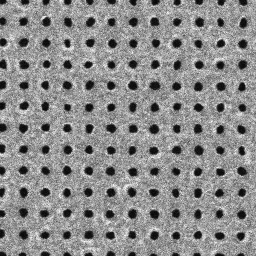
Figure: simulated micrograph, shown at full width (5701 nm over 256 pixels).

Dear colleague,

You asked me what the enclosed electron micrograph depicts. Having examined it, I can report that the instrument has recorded a regular array of holes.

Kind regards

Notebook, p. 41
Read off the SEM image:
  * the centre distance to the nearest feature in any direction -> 466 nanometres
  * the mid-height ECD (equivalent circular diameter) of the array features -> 0.201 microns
